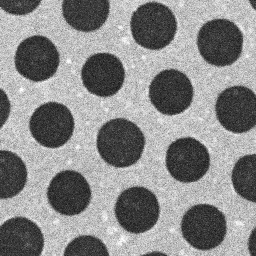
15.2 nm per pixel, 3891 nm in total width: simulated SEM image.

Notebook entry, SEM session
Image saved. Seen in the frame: a regular array of holes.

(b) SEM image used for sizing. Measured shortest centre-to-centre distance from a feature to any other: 1.04 microns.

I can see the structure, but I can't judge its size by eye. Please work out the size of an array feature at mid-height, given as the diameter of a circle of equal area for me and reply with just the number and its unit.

0.698 micrometres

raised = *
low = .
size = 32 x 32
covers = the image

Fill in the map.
.....***......****..***********.
*...****......***.....**********
********.....***......****...***
*********...****......***.....**
****.************.....***.....**
**.....**********....****.....**
**.....******************.....**
**.....****....***********....**
**.....***.....*****************
***....***......***....*********
**********.....****.....********
.**********....****.....****....
.******************.....***.....
.****....**********....****.....
.***.....******************.....
.***.....****....***********....
****.....***......***********..*
****.....***......****...*******
******.*****......***.....******
..***********.....***.....****..
...***********...****.....***...
...*****..***********.....***...
...***.....***********...****...
...***.....*****..***********...
..****.....****....***********..
******.....***......*****.******
*******...****......***.....****
*...***********.....***.....****
.....**********....****.....****
.....*****..***********.....***.
......**.....***********....***.
.....***......*****.***********.